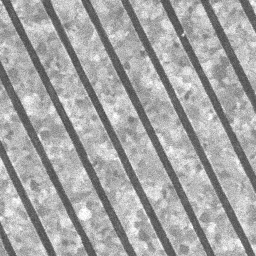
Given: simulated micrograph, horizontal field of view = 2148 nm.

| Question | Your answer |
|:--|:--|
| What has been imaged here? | parallel lines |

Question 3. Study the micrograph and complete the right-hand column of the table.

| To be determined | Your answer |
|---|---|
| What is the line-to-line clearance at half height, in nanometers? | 72.4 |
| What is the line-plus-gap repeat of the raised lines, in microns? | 0.298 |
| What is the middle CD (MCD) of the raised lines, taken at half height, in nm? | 223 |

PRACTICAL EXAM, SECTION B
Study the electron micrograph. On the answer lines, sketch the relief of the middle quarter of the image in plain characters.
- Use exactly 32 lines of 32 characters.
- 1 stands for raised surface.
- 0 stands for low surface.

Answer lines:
11000111111100011111110001111111
11100111111110011111111001111111
11100011111110001111111000111111
11110011111111001111111100111111
11110001111111000111111100011111
11111001111111100111111110011111
11111000111111100011111110001111
11111100111111110011111111001111
11111100011111110001111111000111
11111110011111111001111111100111
11111110001011111000111111100011
11111111001011111100111111110011
01001111000111111100011111110001
01000111100101111110011111111001
00000111100010111110001111111000
00000111110010111111001111111100
10001111110001111111000111111100
10011111111001111111100111111110
10001111111000111111100011111110
11000111111100111111110011111111
01000111111100011111110001111111
01100111111110011111111001111111
11100011111110001111111000111111
11110011111111001111111100111111
11110001111111000111111100011111
11111001111111100111111110011111
11111000111111100011111110001111
11111100111111110011111111001111
11111100011111110001111111000111
11111110011111111001111111100111
11111110001111111000111111100011
11111111001111111100111111110011